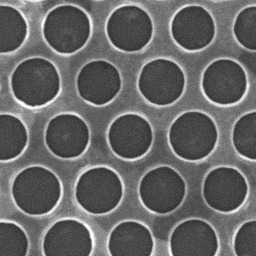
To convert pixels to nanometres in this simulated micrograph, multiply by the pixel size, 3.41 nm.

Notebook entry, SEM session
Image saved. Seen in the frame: a regular array of holes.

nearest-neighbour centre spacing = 62.2 pixels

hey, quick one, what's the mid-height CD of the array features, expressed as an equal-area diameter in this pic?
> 158 nm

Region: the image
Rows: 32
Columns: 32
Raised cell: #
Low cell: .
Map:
################################
..####.....###....####....####..
...###.....###.....###.....##...
...##......##......##......##...
...##......###.....###.....##...
...###.....###....####....####..
.######..#######################
###...#############..######..###
##.....###....####.....###....##
#......###.....##......##......#
#.......##.....##......##......#
##.....###.....###.....###.....#
##....#####...####....####....##
################################
..#####...#####...####....####..
...###.....###.....###.....##...
...###.....###.....##......##...
...###.....###.....##......##...
...###.....###.....###.....##...
..#####...#####...####....####..
################################
###...#####...#####...####....##
##.....###.....###.....###.....#
#.......#......##......##......#
##......#......###.....##......#
##.....###.....###.....###....##
###...#####...#####..#######.###
########.##############..#######
...###.....###....####.....###..
...###.....###.....##......##...
....#.......#......##......##...
...##......###.....##......##...